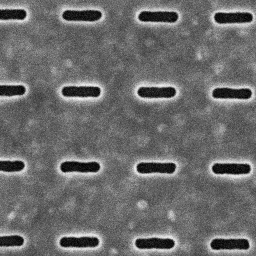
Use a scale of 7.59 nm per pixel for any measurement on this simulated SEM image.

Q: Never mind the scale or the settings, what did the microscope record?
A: a regular array of holes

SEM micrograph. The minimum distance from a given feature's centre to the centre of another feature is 570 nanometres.